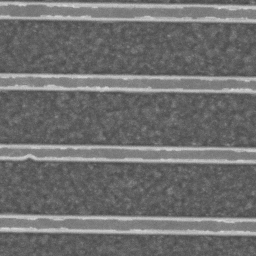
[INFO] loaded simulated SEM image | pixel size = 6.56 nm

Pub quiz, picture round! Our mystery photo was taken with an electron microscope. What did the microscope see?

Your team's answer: one or a few lines or trenches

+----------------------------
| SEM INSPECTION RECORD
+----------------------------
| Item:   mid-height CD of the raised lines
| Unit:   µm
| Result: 0.0943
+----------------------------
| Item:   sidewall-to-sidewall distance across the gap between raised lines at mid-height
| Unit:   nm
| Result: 378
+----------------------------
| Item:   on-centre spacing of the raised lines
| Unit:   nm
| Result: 466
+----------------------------